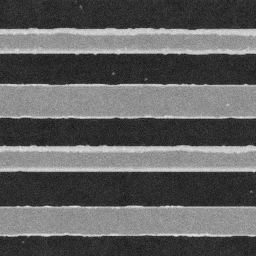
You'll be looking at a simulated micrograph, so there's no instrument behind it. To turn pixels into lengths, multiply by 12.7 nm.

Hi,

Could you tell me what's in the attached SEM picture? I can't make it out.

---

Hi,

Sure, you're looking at lines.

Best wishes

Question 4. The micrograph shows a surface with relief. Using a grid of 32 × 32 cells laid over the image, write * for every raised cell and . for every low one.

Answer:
................................
................................
................................
................................
********************************
********************************
********************************
................................
................................
................................
................................
********************************
********************************
********************************
********************************
................................
................................
................................
*************************..**.**
********************************
********************************
................................
................................
................................
................................
................................
********************************
********************************
********************************
................................
................................
................................